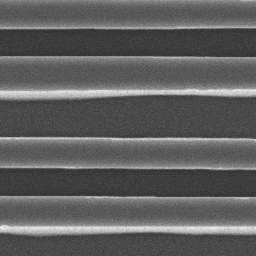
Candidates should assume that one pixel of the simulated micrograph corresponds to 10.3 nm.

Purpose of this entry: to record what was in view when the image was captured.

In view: lines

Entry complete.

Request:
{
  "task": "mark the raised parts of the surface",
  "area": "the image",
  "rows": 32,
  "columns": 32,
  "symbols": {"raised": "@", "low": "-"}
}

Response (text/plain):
@@@@@@@@@@@@@@@@@@@@@@@@@@@@@@@@
@@@@@@@@@@@@@@@@@@@@@@@@@@@@@@@@
@@@@@@@@@@@@@@@@@@@@@@@@@@@@@@@@
--------------------------------
--------------------------------
--------------------------------
--------------------------------
@@@@@@@@@@@@@@@@@@@@@@@@@@@@@@@@
@@@@@@@@@@@@@@@@@@@@@@@@@@@@@@@@
@@@@@@@@@@@@@@@@@@@@@@@@@@@@@@@@
@@@@@@@@@@@@@@@@@@@@@@@@@@@@@@@@
@@@@@@@@@@@@@@@@@@----------@@@@
--------------------------------
--------------------------------
--------------------------------
--------------------------------
--------------------------------
@@@@@@@@@@@@@@@@@@@@@@@@@@@@@@@@
@@@@@@@@@@@@@@@@@@@@@@@@@@@@@@@@
@@@@@@@@@@@@@@@@@@@@@@@@@@@@@@@@
@@@@@@@@@@@@@@@@@@@@@@@@@@@@@@@@
--------------------------------
--------------------------------
--------------------------------
--------------------------------
@@@@@@@@@@@@@@@@@@@@@@@@@@@@@@@@
@@@@@@@@@@@@@@@@@@@@@@@@@@@@@@@@
@@@@@@@@@@@@@@@@@@@@@@@@@@@@@@@@
@@@@@@@@@@@@@@@@@@@@@@@@@@@@@@@@
--------------------------------
--------------------------------
--------------------------------